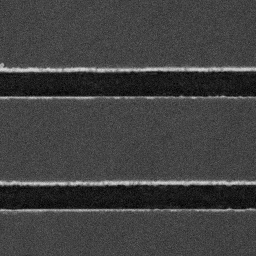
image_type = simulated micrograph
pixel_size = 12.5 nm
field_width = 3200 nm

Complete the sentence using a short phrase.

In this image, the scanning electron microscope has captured lines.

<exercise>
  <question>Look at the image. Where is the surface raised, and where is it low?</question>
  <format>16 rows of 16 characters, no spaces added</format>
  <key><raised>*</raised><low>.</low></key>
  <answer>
****************
****************
****************
****************
................
................
****************
****************
****************
****************
****************
..**............
................
****************
****************
****************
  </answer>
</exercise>